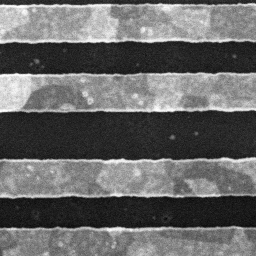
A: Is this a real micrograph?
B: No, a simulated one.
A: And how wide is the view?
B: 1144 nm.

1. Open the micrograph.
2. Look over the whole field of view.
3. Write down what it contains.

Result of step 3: lines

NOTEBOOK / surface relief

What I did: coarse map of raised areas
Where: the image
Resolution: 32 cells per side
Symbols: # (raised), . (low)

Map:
................................
################################
################################
################################
################################
................................
................................
................................
................................
################################
################################
################################
################################
################################
................................
................................
................................
................................
................................
................................
################################
################################
################################
################################
################.###########....
................................
................................
................................
..........#................###..
################################
################################
################################